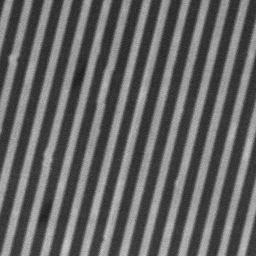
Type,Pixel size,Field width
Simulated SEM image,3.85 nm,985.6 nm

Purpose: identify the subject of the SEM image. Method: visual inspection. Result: parallel lines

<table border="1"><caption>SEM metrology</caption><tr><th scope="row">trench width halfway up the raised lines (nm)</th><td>48.7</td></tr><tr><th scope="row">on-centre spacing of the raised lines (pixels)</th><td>19.1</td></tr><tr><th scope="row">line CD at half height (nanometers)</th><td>24.3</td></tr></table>